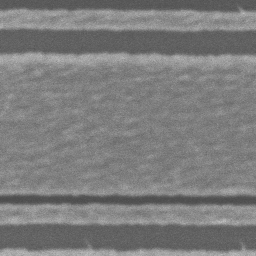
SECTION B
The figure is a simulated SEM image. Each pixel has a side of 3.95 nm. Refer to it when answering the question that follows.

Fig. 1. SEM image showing lines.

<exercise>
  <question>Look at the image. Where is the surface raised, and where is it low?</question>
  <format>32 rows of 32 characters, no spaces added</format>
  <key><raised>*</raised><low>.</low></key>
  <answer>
................................
*************************.....*.
********************************
********************************
................................
................................
................................
********************************
********************************
********************************
********************************
********************************
********************************
********************************
********************************
********************************
********************************
********************************
********************************
********************************
********************************
********************************
********************************
********************************
................................
................................
********************************
********************************
................................
................................
................................
................................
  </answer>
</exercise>